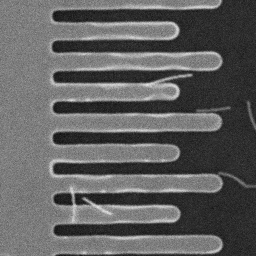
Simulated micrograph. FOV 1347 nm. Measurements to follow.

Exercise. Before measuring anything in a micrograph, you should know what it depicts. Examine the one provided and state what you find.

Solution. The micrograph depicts groups of lines, slits or small figures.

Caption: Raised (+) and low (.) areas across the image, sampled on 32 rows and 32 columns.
+++++++++++++++++++++++++++.....
+++++++.........................
+++++++.........................
++++++++++++++++++++++..........
++++++++++++++++++++++..........
+++++++.........................
+++++++.........................
++++++++++++++++++++++++++++....
++++++++++++++...++++..++++.....
+++++++.........................
+++++++...........+.............
++++++++++++++++++++++..........
++++++++++++++++++..............
+++++++.........................
+++++++++++++++++++++++++++.....
++++++++++++++++++++++++++++....
+++++++.........................
+++++++.........................
++++++++++++++++++++++..........
++++++++++++++++++++++..........
+++++++.........................
+++++++.........................
++++++++++++++++++++++++++++....
+++++++++++++++++++++++++++.....
+++++++.........................
+++++++....+....................
++++++++++++++++++++++..........
++++++++++++++++++++++..........
+++++++.........................
+++++++.........................
++++++++++++++++++++++++++++....
+++++++++++++++++++++++++++.....